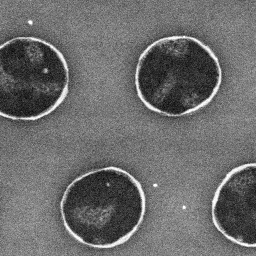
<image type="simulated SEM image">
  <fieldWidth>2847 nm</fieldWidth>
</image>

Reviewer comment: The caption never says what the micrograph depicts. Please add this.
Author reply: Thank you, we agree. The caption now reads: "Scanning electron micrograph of raised bodies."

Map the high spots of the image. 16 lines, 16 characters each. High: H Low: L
LLLLLLLLLLLLLLLL
LLLLLLLLLLLLLLLL
LHLLLLLLLLHHLLLL
HHHHLLLLLHHHHLLL
HHHHLLLLLHHHHHLL
HHHHLLLLLHHHHHLL
HHHHLLLLLHHHHLLL
LLLLLLLLLLLLLLLL
LLLLLLLLLLLLLLLL
LLLLLLLLLLLLLLLL
LLLLLLLLLLLLLLLH
LLLLHHHHHLLLLLHH
LLLLHHHHHLLLLHHH
LLLLHHHHHLLLLHHH
LLLLHHHHLLLLLLHH
LLLLLLLLLLLLLLLL